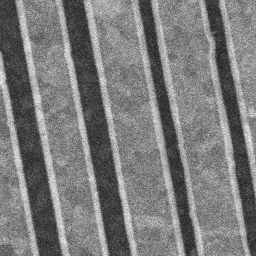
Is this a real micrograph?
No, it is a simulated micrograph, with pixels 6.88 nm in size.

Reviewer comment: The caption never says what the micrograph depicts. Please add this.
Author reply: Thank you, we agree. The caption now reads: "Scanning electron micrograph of one or a few lines or trenches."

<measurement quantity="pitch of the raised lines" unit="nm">470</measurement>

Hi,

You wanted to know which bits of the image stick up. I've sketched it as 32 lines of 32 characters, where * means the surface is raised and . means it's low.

..*****....******..******...****
...*****...******..******...****
...*****...******...******..****
...*****....*****...******..****
...*****....******..******...***
...*****....******..*******..***
....****....******..******...***
....*****...******...*****...***
....*****...******...******..***
....*****....******..******..***
....*****....******..******...**
*...*****....******..******...**
*....*****...******...*****...**
*....*****....*****...******..**
*....*****....*****...******...*
*....*****....******..******...*
**...*****....******..******...*
**....*****...******...*****...*
**....*****...******...******..*
**....*****....*****...******..*
**....*****....******..******...
***...*****....******..******...
***....*****...******..******...
***....*****...******...*****...
***....*****...******...*****...
***....*****....******..******..
***....*****....******..******..
****...*****....******..******..
****....*****...******...*****..
****....*****...******...*****..
****....*****....******..******.
****....*****....******..******.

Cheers